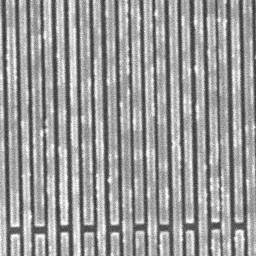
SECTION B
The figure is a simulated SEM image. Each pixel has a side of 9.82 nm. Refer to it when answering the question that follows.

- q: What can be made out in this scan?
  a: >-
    parallel lines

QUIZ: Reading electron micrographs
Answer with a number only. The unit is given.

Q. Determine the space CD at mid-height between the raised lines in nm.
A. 47.9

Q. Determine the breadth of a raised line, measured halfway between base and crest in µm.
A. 0.0761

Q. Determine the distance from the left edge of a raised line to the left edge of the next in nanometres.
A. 122